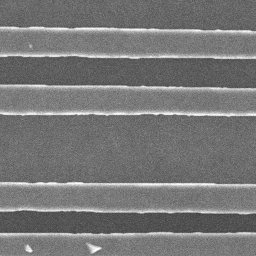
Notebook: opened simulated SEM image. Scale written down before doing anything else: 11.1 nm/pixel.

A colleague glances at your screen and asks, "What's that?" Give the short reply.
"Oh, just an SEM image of lines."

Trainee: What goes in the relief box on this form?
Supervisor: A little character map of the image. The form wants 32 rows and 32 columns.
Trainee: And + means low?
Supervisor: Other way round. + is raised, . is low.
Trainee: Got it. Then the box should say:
................................
................................
................................
++++++..........................
++++++++++++++++++++++++++++++++
++++++++++++++++++++++++++++++++
++++++++++++++++++++++++++++++++
................................
................................
................................
................................
++++++++++++++++++++++++++++++++
++++++++++++++++++++++++++++++++
++++++++++++++++++++++++++++++++
................................
................................
................................
................................
................................
................................
................................
................................
................................
++++++++++++++++++++++++++++++++
++++++++++++++++++++++++++++++++
++++++++++++++++++++++++++++++++
.................+...+...+++++++
................................
................................
++++++++++++++++++++++++++++++++
++++++++++++++++++++++++++++++++
++++++++++++++++++++++++++++++++